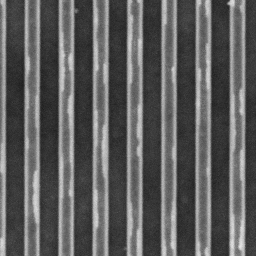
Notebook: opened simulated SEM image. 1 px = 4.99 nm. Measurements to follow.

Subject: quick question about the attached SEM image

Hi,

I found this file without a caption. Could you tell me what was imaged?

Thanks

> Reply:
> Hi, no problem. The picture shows parallel lines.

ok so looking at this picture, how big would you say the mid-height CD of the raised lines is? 0.0661 microns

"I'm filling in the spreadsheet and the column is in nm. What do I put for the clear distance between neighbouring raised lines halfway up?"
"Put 106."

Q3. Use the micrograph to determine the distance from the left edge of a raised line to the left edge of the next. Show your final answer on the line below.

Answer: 171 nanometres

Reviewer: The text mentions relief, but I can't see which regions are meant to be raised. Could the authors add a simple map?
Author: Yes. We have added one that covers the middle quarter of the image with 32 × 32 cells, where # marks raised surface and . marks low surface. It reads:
##......###.....###......###....
##......###.....###......###....
##......###.....###......###....
##......###.....###......###....
##......###.....###......###....
##......###.....###......###....
##......###.....###......###....
##......###.....###......###....
##......###.....###......###....
##......###.....###......###....
##......###.....###......###....
##......###.....###......###....
##......###.....###......###....
##......###.....###......###....
##......###.....###......###....
##......###.....###......###....
##......###.....###......###....
##......###.....###......###....
##......###.....###......###....
##......###.....###......###....
##......###.....###......###....
##......###.....###......###....
##......###.....###......###....
##......###.....###......###....
##......###.....###......###....
##......###.....###......###....
##......###.....###......###....
##......###.....###......###....
##......###.....###......###....
##......###.....###......###....
##......###.....###......###....
##......###.....###......###....